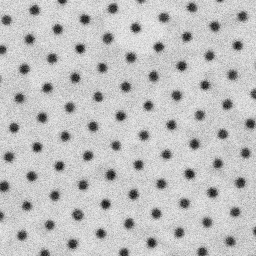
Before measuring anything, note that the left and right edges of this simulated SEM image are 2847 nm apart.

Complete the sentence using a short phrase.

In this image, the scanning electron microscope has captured a regular array of holes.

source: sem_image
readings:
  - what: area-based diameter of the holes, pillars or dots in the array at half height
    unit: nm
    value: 116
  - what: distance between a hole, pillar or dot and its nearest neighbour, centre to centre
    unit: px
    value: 29.5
